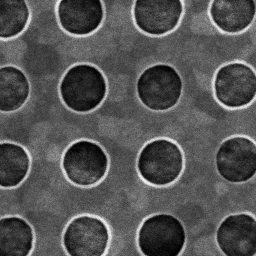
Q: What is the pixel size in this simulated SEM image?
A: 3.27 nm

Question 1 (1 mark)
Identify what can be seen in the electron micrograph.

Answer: holes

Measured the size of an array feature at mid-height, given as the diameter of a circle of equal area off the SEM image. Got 147 nm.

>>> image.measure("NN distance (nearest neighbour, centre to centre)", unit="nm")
245